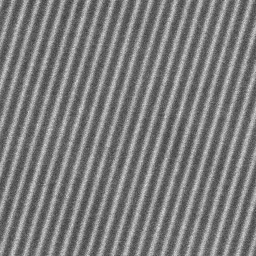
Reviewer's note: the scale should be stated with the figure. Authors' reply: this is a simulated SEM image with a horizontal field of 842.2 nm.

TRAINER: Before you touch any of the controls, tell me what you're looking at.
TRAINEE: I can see parallel lines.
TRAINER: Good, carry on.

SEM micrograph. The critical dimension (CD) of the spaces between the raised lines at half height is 28.4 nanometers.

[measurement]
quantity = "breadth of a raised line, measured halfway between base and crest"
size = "0.0095 microns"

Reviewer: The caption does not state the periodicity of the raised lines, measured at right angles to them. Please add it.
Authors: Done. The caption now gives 39.5 nanometres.